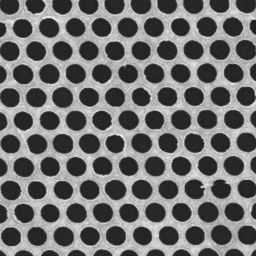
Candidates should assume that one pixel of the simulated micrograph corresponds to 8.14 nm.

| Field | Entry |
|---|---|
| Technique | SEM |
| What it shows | a regular array of holes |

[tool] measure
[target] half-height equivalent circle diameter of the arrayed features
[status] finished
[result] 19.7 px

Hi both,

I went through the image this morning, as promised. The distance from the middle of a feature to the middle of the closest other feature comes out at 0.213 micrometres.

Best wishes